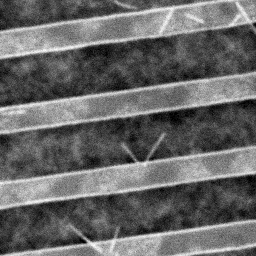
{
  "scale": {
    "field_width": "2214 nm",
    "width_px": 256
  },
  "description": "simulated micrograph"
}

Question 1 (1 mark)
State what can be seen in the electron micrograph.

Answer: lines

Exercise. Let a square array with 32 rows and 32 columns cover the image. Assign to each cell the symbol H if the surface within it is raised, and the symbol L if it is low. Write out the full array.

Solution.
LLLLLLLLLLLLLLLLLLLLLLLLHHHHHHHH
LLLLLLLLLLLLLLLLLLHHHHHHHHHHHHHH
LLLLLLLLLLLHHHHHHHHHHHHHHHHHHHHH
LLLHHHHHHHHHHHHHHHHHHHHHHHHHLLLL
HHHHHHHHHHHHHHHHHHHHLLLLLLLLLLLL
HHHHHHHHHHHHLLLLLLLLLLLLLLLLLLLL
HHHHHLLLLLLLLLLLLLLLLLLLLLLLLLLL
LLLLLLLLLLLLLLLLLLLLLLLLLLLLLLLL
LLLLLLLLLLLLLLLLLLLLLLLLLLLLLLLL
LLLLLLLLLLLLLLLLLLLLLLLLLLLLLHHH
LLLLLLLLLLLLLLLLLLLLLLHHHHHHHHHH
LLLLLLLLLLLLLLLHHHHHHHHHHHHHHHHH
LLLLLLLHHHHHHHHHHHHHHHHHHHHHHHLL
HHHHHHHHHHHHHHHHHHHHHHHLLLLLLLLL
HHHHHHHHHHHHHHHHLLLLLLLLLLLLLLLL
HHHHHHHHLLLLLLLLLLLLLLLLLLLLLLLL
HHLLLLLLLLLLLLLLLLLLLLLLLLLLLLLL
LLLLLLLLLLLLLLLLLLLLLLLLLLLLLLLL
LLLLLLLLLLLLLLLLLLLLLLLLLLLLLLLH
LLLLLLLLLLLLLLLLLLLLLLLLHHHHHHHH
LLLLLLLLLLLLLLLLHHHHHHHHHHHHHHHH
LLLLLLLLLLHHHHHHHHHHHHHHHHHHHHHH
LLLHHHHHHHHHHHHHHHHHHHHHHHLLLLLL
HHHHHHHHHHHHHHHHHHHLLLLLLLLLLLLL
HHHHHHHHHHHLLLLLLLLLLLLLLLLLLLLL
HHHLLLLLLLLLLLLLLLLLLLLLLLLLLLLL
LLLLLLLLLLLLLLLLLLLLLLLLLLLLLLLL
LLLLLLLLLLLLLLLLLLLLLLLLLLLLLLLL
LLLLLLLLLLLLLLLLLLLLLLLLLHHHHHHH
LLLLLLLLLLLLLLLLLLHHHHHHHHHHHHHH
LLLLLLLLLLHHHHHHHHHHHHHHHHHHHHHH
LLLHHHHHHHHHHHHHHHHHHHHHHHLLLLLL